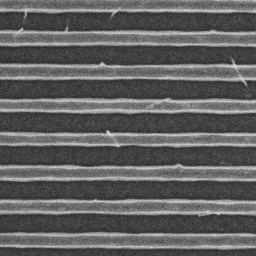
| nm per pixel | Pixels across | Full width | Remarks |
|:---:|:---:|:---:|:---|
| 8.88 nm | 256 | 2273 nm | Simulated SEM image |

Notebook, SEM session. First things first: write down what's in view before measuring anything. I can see parallel lines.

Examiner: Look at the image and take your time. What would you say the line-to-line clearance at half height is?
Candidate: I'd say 191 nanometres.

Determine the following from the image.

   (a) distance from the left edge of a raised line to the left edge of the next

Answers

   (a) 299 nanometers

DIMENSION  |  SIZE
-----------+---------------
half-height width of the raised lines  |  0.112 microns